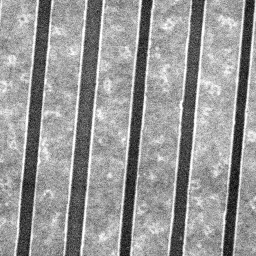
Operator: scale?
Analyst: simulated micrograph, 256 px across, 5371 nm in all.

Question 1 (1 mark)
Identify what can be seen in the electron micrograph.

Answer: parallel lines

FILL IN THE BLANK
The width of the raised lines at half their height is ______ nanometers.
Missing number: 779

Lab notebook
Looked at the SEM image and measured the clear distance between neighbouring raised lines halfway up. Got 288 nm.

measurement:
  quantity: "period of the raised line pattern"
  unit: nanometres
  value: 1080